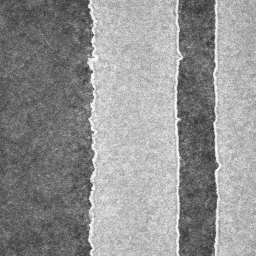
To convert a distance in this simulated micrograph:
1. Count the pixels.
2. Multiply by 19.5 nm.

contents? one or a few lines or trenches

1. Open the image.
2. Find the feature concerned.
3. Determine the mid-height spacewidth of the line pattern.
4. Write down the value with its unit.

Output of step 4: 748 nanometers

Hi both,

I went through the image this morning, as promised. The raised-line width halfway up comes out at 1.66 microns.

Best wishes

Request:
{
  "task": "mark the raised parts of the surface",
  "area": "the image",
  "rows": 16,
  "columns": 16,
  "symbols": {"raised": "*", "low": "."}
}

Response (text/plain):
......*****..***
......*****...**
......*****..***
......*****..***
......*****..***
......*****..***
......*****..***
......*****..***
......*****..***
......*****...**
......*****...**
......*****...**
......*****...**
......*****...**
......*****...**
......*****..***